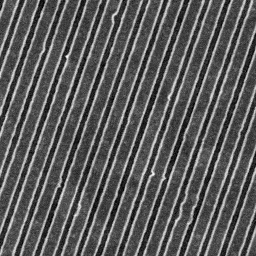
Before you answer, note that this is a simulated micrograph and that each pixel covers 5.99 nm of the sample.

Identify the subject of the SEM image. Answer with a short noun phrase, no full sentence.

parallel lines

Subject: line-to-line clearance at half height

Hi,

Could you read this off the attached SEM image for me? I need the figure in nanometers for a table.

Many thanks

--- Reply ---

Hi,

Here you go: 36.1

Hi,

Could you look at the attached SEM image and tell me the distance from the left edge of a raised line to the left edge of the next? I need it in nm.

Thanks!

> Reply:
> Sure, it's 117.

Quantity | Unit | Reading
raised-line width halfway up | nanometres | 77.9